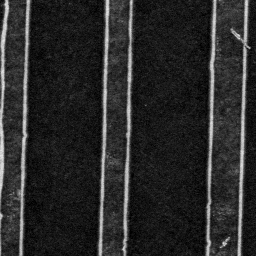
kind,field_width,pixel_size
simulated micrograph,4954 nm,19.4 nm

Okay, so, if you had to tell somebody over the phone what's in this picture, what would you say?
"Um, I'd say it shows one or a few lines or trenches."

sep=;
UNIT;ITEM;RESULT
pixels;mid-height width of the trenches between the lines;81.1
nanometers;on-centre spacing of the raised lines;2090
